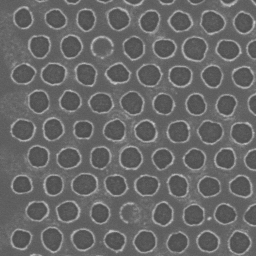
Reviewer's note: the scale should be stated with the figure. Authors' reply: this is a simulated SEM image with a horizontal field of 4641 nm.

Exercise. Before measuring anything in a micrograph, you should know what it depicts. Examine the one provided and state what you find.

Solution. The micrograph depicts a regular array of holes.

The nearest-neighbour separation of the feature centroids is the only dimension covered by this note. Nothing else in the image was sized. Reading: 556 nm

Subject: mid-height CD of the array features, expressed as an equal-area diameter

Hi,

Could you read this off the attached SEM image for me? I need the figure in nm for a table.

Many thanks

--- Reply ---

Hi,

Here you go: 367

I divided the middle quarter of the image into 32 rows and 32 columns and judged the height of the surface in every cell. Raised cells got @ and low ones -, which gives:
@@@@---@@@@@---@@@@@---@@@@@@@@@
@@@-----@@@-----@@@-----@@@----@
@@@-----@@@-----@@------@@------
@@@-----@@@-----@@@-----@@@-----
@@@@----@@@@@-@@@@@----@@@@----@
@@@@@@@@@@@@@@@@@@@@@@@@@@@@--@@
@@@@@@@@@@@@@@@@@@@@@@@@@@@@@@@@
---@@@@@--@@@@@@--@@@@@@-@@@@@@@
----@@@-----@@-----@@@@----@@@@-
----@@------@@------@@-----@@@@-
----@@@-----@@------@@-----@@@@-
@--@@@@----@@@@----@@@@----@@@@-
@@@@@@@@@@@@@@@@@-@@@@@@@-@@@@@@
@@@@@@@@@@@@@@@@@@@@@@@@@@@@@@@@
@@@---@@@@@---@@@@@@-@@@@@@@--@@
@@@----@@@-----@@@----@@@@-----@
@@@----@@@-----@@@-----@@@-----@
@@@----@@@-----@@@-----@@@-----@
@@@@--@@@@@----@@@@----@@@-----@
@@@@@@@@@@@@@@@@@@@@@@@@@@@@-@@@
@@@@@@@@@@@@@@@@@@@@@@@@@@@@@@@@
---@@@@----@@@@---@@@@@@--@@@@@@
----@@@-----@@-----@@@@----@@@@-
----@@@-----@@-----@@@-----@@@--
----@@@----@@@-----@@@-----@@@--
---@@@@@---@@@@----@@@@---@@@@@-
@@@@@@@@@@@@@@@@@@@@@@@@@@@@@@@@
@@@@@-@@@@@@@@@@@@@@@@@@@@@@@@@@
@@@-----@@@----@@@@----@@@@---@@
@@------@@-----@@@------@@-----@
@@------@@------@@------@@-----@
@@------@@@----@@@-----@@@@----@